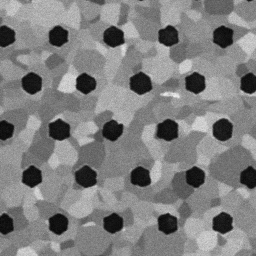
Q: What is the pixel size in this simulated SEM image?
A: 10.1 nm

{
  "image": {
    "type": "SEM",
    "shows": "a regular array of holes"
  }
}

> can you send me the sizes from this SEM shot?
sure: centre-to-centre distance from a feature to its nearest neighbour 542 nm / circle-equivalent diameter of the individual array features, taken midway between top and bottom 0.216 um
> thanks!